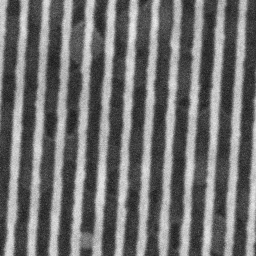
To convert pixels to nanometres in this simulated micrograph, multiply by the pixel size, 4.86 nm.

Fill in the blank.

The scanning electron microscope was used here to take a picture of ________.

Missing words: parallel lines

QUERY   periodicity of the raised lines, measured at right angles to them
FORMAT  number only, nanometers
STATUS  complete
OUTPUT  106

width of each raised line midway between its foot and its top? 6.73 px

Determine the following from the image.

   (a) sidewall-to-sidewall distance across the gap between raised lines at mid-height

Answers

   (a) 73.9 nm